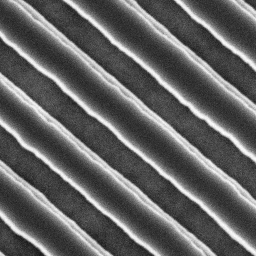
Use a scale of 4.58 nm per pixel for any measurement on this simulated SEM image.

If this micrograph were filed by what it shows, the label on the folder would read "lines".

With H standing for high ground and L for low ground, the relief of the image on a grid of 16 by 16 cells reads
HLLLLHHHLLLHHHHL
HHHLLLHHHLLLLHHH
HHHHLLLHHHHLLLHH
LHHHHLLLHHHHLLLH
LLLHHHLLLHHHHLLL
HLLLHHHLLLHHHHLL
HHLLLHHHHLLLHHHL
HHHLLLHHHHLLLHHH
LHHHLLLHHHHLLLHH
LLHHHLLLHHHHLLLH
LLLHHHHLLLHHHLLL
HLLLHHHHLLLHHHLL
HHLLLLHHHLLLHHHL
HHHHLLLHHHLLLHHH
LHHHHLLLHHHLLLHH
LLHHHHLLLHHHLLLH